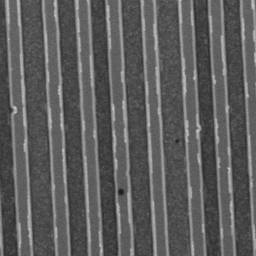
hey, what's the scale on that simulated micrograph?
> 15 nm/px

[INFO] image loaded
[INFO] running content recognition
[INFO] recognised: parallel lines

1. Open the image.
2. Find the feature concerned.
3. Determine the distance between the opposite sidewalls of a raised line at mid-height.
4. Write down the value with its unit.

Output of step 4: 0.204 µm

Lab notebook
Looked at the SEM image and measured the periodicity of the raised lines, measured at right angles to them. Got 506 nm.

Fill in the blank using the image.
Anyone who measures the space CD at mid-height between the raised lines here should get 18.6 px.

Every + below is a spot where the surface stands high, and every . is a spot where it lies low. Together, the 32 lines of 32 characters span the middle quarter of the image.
....+++....++++.....++++......++
....+++....++++.....++++......++
....+++....++++.....++++......++
....+++....++++.....++++......++
....+++....++++.....++++......++
....+++.....+++.....++++......++
....+++.....+++......+++......++
....+++.....+++......+++......++
....+++.....+++......+++......++
....++++....+++......+++......++
....++++....+++......+++......++
....++++....+++......+++......++
....++++....++++.....+++......++
.....+++....++++.....+++......++
.....+++....++++.....+++......++
.....+++....++++.....+++......++
.....+++....++++.....+++......++
.....+++....++++.....+++......++
.....+++....++++.....+++......++
.....+++....++++.....+++.......+
.....+++....++++.....+++.......+
.....+++....++++.....+++.......+
.....+++....++++.....++++......+
.....+++....++++.....++++......+
.....+++.....+++.....++++......+
.....+++.....+++......+++......+
.....+++.....+++......+++......+
.....+++.....+++......+++......+
.....++++....+++......+++......+
.....++++....+++......+++......+
+....++++....+++......+++......+
+....++++....++++.....+++......+